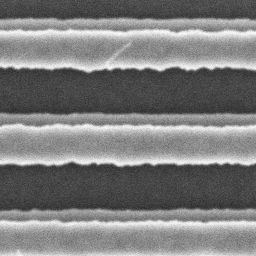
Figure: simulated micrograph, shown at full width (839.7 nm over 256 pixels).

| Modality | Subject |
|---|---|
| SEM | lines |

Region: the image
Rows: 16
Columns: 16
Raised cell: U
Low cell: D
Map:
DDDDDDDDDDDDDDDD
UUUUUUUUUUUUUUUU
UUUUUUUUUUUUUUUU
UUUUUUUUUUUUUUUU
DDDDDDDDDDDDDDDD
DDDDDDDDDDDDDDDD
DDDDDDDDDDDDDDDD
UUUUUUUUUUUUUUUU
UUUUUUUUUUUUUUUU
UUUUUUUUUUUUUUUU
DDDDDDDDDDDDDDDD
DDDDDDDDDDDDDDDD
DDDDDDDDDDDDDDDD
UUUUUUUUUUUUUUUU
UUUUUUUUUUUUUUUU
UUUUUUUUUUUUUUUU